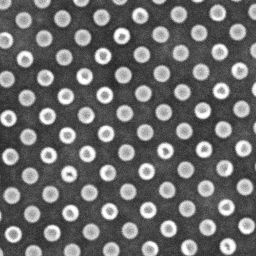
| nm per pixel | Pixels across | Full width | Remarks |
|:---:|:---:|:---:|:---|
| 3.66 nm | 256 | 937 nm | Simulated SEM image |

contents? a regular array of raised bodies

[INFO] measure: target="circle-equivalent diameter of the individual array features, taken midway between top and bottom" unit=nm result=59.4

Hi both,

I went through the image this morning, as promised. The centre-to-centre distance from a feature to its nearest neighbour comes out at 99.5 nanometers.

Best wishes